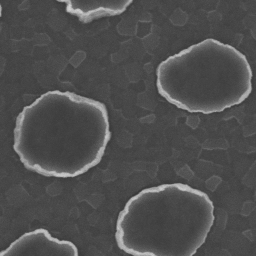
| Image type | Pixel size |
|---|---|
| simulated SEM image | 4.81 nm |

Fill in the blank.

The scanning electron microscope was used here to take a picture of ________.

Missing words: raised bodies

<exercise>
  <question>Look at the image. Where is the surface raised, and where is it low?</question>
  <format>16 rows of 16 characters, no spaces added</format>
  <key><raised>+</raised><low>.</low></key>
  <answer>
....++++........
................
................
...........++++.
..........++++++
..........++++++
..++++.....++++.
.++++++.........
.++++++.........
.+++++..........
..++++..........
................
........+++++...
.......++++++...
..+....++++++...
+++++...++++....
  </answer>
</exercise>